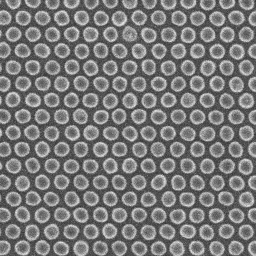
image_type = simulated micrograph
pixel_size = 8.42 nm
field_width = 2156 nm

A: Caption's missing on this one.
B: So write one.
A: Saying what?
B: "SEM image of a regular array of raised bodies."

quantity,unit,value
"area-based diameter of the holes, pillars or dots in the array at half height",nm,120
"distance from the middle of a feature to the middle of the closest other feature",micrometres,0.156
